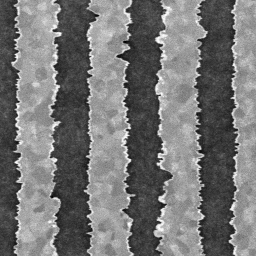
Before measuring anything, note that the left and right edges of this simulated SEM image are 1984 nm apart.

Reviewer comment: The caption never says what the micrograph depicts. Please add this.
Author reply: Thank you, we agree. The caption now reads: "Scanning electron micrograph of one or a few lines or trenches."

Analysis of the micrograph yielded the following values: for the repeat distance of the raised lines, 0.557 um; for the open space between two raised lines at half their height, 275 nanometres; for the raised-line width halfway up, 0.286 µm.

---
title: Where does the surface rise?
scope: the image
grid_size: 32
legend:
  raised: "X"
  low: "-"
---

--XXXXX----XXXXX----XXXXX----XXX
--XXXXX-----XXXX-----XXXX----XXX
--XXXXX-----XXXX----XXXXX----XXX
--XXXXX----XXXXX-----XXXX----XXX
--XXXXX----XXXXX----XXXXXX---XXX
--XXXXX----XXXXX----XXXXX----XXX
--XXXXX----XXXX-----XXXXX----XXX
--XXXXX----XXXX-----XXXXX----XXX
--XXXXX----XXXXX----XXXXX----XXX
--XXXXX----XXXXX----XXXXX----XXX
--XXXXX----XXXXX----XXXX-----XXX
--XXXXX----XXXXX----XXXXX----XXX
--XXXXX----XXXX-----XXXXX----XXX
--XXXX-----XXXXX----XXXXX----XXX
--XXXX-----XXXXX----XXXXX----XXX
--XXXXX----XXXXX----XXXXX----XXX
--XXXXX----XXXXX----XXXXX-----XX
--XXXXX----XXXXX----XXXXX-----XX
--XXXXX----XXXXX----XXXXX-----XX
---XXX-----XXXXX----XXXXX-----XX
--XXXXX----XXXXX----XXXXX----XXX
---XXXX----XXXXX-----XXXX-----XX
---XXXX----XXXXX-----XXXX----XXX
---XXXX----XXXXX-----XXXX-----XX
--XXXX-----XXXXX----XXXXX----XXX
--XXXXXX---XXXXX-----XXXX----XXX
--XXXXX----XXXXX----XXXXX----XXX
--XXXXX----XXXXX----XXXXX----XXX
--XXXXX-----XXXX----XXXXX----XXX
--XXXXX----XXXXX----XXXXX----XXX
--XXXXX----XXXXX----XXXXX----XXX
--XXXXX----XXXXX----XXXXX----XXX